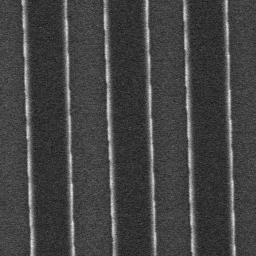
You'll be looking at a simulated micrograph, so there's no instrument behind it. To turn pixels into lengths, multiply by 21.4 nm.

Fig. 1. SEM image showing lines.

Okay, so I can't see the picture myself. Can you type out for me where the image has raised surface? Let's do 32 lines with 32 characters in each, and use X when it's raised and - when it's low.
---XXXXX-----XXXXX-----XXXXX----
---XXXXX-----XXXXX-----XXXXX----
---XXXXX-----XXXXX-----XXXXX----
---XXXXX-----XXXXXX----XXXXX----
---XXXXX-----XXXXXX----XXXXX----
---XXXXX-----XXXXXX----XXXXX----
---XXXXX-----XXXXXX----XXXXXX---
---XXXXX-----XXXXXX----XXXXXX---
---XXXXX-----XXXXXX----XXXXXX---
---XXXXX-----XXXXXX----XXXXXX---
---XXXXX-----XXXXXX----XXXXXX---
---XXXXXX----XXXXXX----XXXXXX---
---XXXXXX----XXXXXX----XXXXXX---
---XXXXXX----XXXXXX----XXXXXX---
---XXXXXX----XXXXXX----XXXXXX---
---XXXXXX-----XXXXX----XXXXXX---
---XXXXXX-----XXXXX----XXXXXX---
---XXXXXX-----XXXXX-----XXXXX---
----XXXXX-----XXXXX-----XXXXX---
----XXXXX-----XXXXX-----XXXXX---
----XXXXX-----XXXXX-----XXXXX---
----XXXXX-----XXXXX-----XXXXX---
----XXXXX-----XXXXX-----XXXXX---
----XXXXX-----XXXXX-----XXXXX---
----XXXXX-----XXXXX-----XXXXX---
----XXXXX-----XXXXX-----XXXXX---
----XXXXX-----XXXXX-----XXXXX---
----XXXXX-----XXXXX-----XXXXX---
----XXXXX-----XXXXX-----XXXXX---
----XXXXX-----XXXXX-----XXXXX---
----XXXXX-----XXXXX-----XXXXX---
----XXXXX-----XXXXX-----XXXXX---